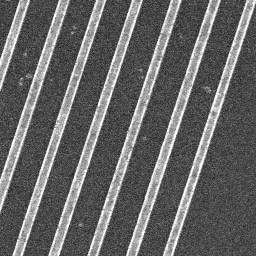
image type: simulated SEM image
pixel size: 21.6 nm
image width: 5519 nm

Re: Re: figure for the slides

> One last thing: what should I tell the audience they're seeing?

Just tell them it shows parallel lines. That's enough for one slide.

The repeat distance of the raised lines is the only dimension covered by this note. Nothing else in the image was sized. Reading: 769 nm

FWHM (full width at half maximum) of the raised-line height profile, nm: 164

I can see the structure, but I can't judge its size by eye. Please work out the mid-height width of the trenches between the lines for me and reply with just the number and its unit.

594 nm